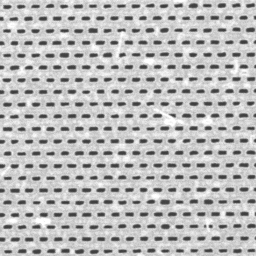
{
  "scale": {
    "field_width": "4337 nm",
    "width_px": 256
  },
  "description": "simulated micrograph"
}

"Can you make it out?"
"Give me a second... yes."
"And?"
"a regular array of holes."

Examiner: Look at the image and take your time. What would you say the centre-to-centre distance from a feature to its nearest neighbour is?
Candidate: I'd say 233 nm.